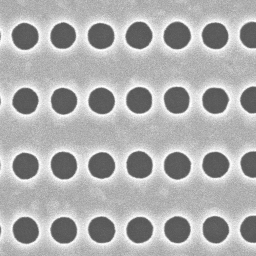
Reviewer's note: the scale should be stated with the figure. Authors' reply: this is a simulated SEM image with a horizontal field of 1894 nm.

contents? a regular array of holes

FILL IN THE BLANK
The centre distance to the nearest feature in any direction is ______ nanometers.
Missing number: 280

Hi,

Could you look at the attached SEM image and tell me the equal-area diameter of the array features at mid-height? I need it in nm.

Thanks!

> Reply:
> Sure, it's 201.